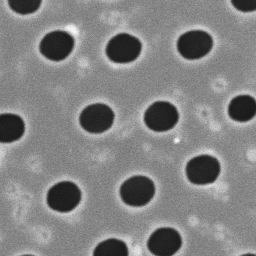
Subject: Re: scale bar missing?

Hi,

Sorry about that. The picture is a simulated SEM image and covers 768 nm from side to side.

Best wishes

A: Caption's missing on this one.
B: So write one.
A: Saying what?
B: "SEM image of a regular array of holes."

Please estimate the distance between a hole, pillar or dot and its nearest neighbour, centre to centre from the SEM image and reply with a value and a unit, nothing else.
202 nanometers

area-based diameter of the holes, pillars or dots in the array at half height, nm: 97.6